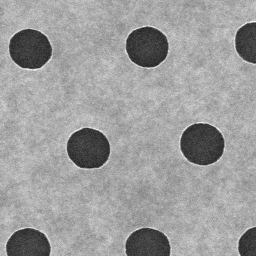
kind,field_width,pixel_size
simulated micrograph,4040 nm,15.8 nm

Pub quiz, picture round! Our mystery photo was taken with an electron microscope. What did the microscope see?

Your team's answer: holes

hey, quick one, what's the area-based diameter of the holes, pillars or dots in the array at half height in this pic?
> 667 nm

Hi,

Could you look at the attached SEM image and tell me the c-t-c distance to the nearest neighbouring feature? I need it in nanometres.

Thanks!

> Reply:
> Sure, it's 1780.